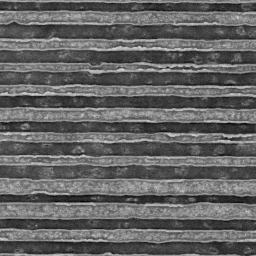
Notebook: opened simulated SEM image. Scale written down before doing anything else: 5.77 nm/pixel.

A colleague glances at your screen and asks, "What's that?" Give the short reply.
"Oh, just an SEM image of parallel lines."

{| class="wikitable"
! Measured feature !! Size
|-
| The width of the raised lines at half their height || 62.7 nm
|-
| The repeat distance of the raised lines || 139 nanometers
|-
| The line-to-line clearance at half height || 0.0728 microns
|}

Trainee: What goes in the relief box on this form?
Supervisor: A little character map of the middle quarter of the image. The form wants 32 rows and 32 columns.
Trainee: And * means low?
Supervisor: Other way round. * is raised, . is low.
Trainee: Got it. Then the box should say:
*******..***********************
********************************
................................
................................
................................
*********..***..................
********************************
********************************
................................
................................
................................
********************************
********************************
********************************
.......................**...****
................................
................................
..******************************
********************************
.........****.................*.
................................
................................
................................
********************************
********************************
................................
................................
................................
................................
********************************
********************************
********************************